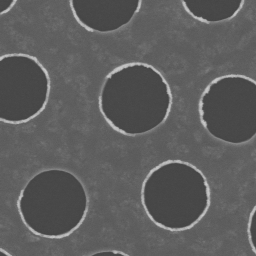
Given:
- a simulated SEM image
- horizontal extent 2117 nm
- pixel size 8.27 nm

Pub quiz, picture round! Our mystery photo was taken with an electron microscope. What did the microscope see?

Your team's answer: holes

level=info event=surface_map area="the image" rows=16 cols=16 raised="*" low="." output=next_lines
*****....***...*
*****...********
****************
****************
...****...******
...****...***...
...***.....**...
*******...***...
*************...
****************
**********..****
**...****....***
*....****....***
*....****...****
**..************
****************